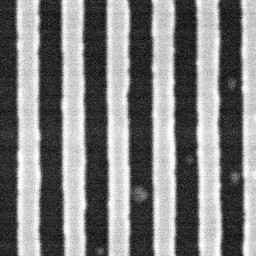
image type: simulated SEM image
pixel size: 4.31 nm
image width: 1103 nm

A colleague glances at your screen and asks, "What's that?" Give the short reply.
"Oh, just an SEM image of lines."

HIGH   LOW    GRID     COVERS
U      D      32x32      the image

DDUUUDDDUUDDDDUUDDDUUUDDDUUDDDUU
DDUUUDDDUUDDDDUUDDDUUUDDDUUDDDUU
DDUUUDDDUUDDDDUUDDDUUUDDDUUDDDUU
DDUUUDDDUUDDDDUUDDDUUUDDDUUDDDUU
DDUUUDDDUUDDDDUUDDDUUUDDDUUDDDUU
DDUUUDDDUUDDDDUUDDDUUUDDDUUDDDUU
DDUUUDDDUUDDDDUUDDDUUUDDDUUDDDUU
DDUUUDDDUUDDDDUUDDDUUUDDDUUDDDUU
DDUUUDDDUUDDDDUUDDDUUUDDDUUDDDUU
DDUUUDDDUUDDDDUUDDDUUUDDDUUDDDUU
DDUUUDDDUUDDDDUUDDDUUUDDDUUDDDUU
DDUUUDDDUUDDDDUUDDDUUUDDDUUDDDUU
DDUUUDDDUUDDDDUUDDDUUUDDDUUDDDDU
DDUUUDDDUUDDDDUUDDDUUUDDDUUDDDDU
DDUUUDDDUUDDDDUUDDDUUUDDDUUDDDDU
DDDUUDDDUUDDDDUUDDDUUUDDDUUDDDDU
DDDUUDDDUUDDDDUUDDDUUUDDDUUDDDDU
DDDUUDDDUUDDDDUUDDDUUUDDDUUDDDDU
DDDUUDDDUUDDDDUUDDDUUUDDDUUDDDDU
DDUUUDDDUUDDDDUUDDDUUUDDDUUDDDDU
DDUUUDDDUUUDDDUUDDDUUUDDDUUDDDDU
DDUUUDDDUUDDDDUUDDDUUUDDDUUDDDDU
DDUUUDDDUUDDDDUUDDDUUUDDDUUDDDDU
DDUUUDDDUUDDDDUUDDDUUUDDDUUDDDDU
DDUUUDDDUUDDDDUUDDDUUUDDDUUDDDDU
DDUUUDDDUUUDDDUUDDDUUUDDDUUDDDDU
DDUUUDDDUUDDDDUUDDDUUUDDDUUDDDDU
DDUUUDDDUUDDDDUUDDDUUUDDDUUDDDDU
DDUUUDDDUUDDDDUUDDDUUUDDDUUDDDDU
DDUUUDDDUUDDDDUUDDDUUUDDDUUUDDDU
DDUUUDDDUUUDDDUUDDDUUUDDDUUDDDDU
DDUUUDDDUUDDDDUUDDDUUUDDDUUDDDDU